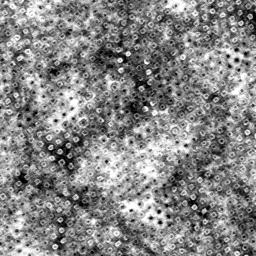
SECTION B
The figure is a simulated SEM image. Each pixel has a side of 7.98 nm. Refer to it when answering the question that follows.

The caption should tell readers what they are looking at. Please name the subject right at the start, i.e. a regular array of raised bodies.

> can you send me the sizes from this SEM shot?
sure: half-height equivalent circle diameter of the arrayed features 37.1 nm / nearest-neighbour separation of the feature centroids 79.8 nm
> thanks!